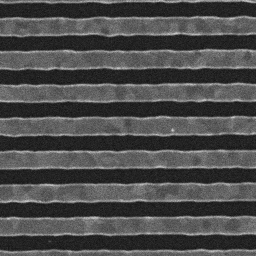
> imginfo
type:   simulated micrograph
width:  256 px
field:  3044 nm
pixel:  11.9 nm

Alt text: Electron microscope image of wiring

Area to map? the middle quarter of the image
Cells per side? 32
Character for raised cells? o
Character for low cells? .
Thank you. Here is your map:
oooooooooooooooooooooooooooooooo
................................
................................
................................
................................
oooooooooooooooooooooooooooooooo
oooooooooooooooooooooooooooooooo
oooooooooooooooooooooooooooooooo
oooooooooooooooooooooooooooooooo
.......ooooo....................
................................
................................
................................
....oooooo.ooooooo...ooooooooooo
oooooooooooooooooooooooooooooooo
oooooooooooooooooooooooooooooooo
oooooooooooooooooooooooooooooooo
oooooooooooooooooooooooooooooooo
................................
................................
................................
................................
oooooooooooooooooooooooooooooooo
oooooooooooooooooooooooooooooooo
oooooooooooooooooooooooooooooooo
oooooooooooooooooooooooooooooooo
................................
................................
................................
................................
oooooooooooooooooooooooooooooooo
oooooooooooooooooooooooooooooooo